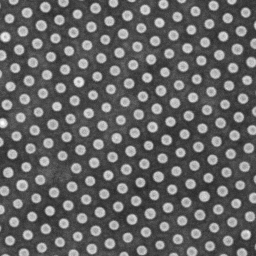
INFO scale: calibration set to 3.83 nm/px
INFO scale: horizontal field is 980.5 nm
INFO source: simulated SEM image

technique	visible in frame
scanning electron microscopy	a regular array of raised bodies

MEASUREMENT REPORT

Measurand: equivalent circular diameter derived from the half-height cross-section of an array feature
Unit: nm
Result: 36.9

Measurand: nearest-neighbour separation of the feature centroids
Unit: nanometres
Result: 71.2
